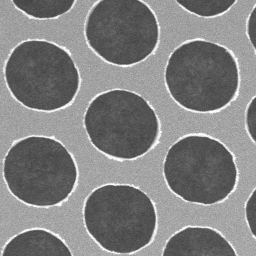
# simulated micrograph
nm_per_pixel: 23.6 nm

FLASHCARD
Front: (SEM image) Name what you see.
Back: holes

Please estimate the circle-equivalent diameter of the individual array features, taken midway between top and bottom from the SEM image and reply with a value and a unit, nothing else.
1670 nm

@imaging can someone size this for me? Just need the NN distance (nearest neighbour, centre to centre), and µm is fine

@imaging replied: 2.2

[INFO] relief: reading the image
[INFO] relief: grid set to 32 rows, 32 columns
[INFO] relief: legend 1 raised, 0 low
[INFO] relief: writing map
11000000011100000011110000000111
11100000111000000001111100001111
11111111111000000001111111111110
11111111111000000000111111111110
11111111111000000000111111111110
11100011111000000000111000011111
11000000111100000001110000000111
10000000011110000011100000000111
10000000001111111111100000000011
10000000001111111111100000000011
10000000001111111111100000000011
10000000001110001111100000000111
11000000011100000011110000000111
11110001111000000001111000001110
11111111111000000000111111111110
11111111111000000000111111111110
11111111111000000000111111111110
11100001111000000001111000011111
10000000111100000001100000001111
10000000011111000111100000000111
00000000011111111111100000000111
00000000001111111111100000000011
10000000011111111111100000000111
10000000011100000111100000000111
11000000111000000011110000001110
11110001111000000001111110011110
11111111111000000001111111111110
11111111111000000001111111111110
11111111111000000001111000111110
11000001111100000001110000001111
10000000111100000011100000000111
00000000011111000111000000000111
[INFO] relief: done